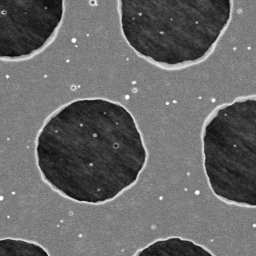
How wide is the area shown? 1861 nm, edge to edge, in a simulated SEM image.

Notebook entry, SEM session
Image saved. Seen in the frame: holes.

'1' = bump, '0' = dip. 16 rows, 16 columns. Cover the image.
0000111100000011
0000111100000011
0001111100000111
0011111110000111
1111111111111111
1111111111111111
1111000111111100
1110000011111000
1100000001111000
1100000001111000
1110000001111000
1110000011111000
1111100111111100
1111111111111111
1111111111111111
0001111110000111